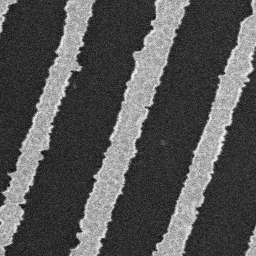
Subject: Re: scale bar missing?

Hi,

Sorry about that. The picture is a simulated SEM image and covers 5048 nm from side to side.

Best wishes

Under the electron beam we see one or a few lines or trenches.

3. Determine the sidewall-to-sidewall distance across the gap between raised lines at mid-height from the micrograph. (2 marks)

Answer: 1180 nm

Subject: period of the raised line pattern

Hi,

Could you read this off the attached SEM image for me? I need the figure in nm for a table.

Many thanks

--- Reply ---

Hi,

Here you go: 1620